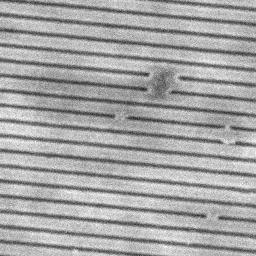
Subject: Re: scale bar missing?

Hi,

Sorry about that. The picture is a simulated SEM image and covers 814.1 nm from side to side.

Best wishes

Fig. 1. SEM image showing parallel lines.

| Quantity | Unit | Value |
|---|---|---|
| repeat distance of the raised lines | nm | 47.9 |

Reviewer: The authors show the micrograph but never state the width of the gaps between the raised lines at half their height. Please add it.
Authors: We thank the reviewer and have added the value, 0.015 microns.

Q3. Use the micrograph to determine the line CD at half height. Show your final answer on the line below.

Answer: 10.6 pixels